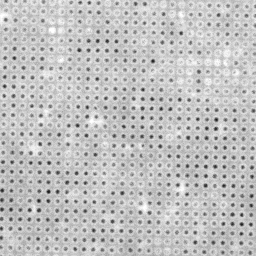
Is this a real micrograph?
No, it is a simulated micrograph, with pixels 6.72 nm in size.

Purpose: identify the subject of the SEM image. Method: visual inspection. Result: a regular array of holes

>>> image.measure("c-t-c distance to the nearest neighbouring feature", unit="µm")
0.0605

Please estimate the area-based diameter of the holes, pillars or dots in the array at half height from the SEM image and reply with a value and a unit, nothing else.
32.2 nm